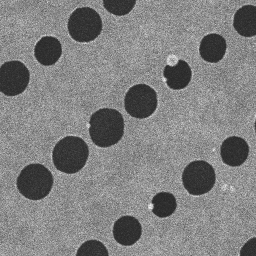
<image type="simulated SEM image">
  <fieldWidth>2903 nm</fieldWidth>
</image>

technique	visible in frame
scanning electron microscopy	a regular array of holes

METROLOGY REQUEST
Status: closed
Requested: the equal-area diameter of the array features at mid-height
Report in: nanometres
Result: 367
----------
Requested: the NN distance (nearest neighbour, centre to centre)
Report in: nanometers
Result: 503